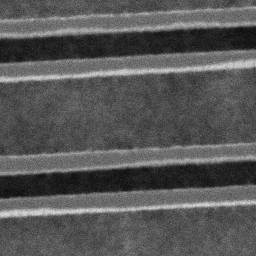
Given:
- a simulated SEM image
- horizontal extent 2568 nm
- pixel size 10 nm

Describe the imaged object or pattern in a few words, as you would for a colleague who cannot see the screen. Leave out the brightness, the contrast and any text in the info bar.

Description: lines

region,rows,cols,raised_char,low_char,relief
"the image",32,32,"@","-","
--------------------------------
---------------------@@@@@@@@@@@
---@@@@@@@@@@@@@@@@@@@@@@@@@@@@@
@@@@@@@@@@@@@@@@@@@@@@@@--------
@@@@@@--------------------------
--------------------------------
--------------------------@@@@@@
--------@@@@@@@@@@@@@@@@@@@@@@@@
@@@@@@@@@@@@@@@@@@@@@@@@@@@@----
@@@@@@@@@@@---------------------
--------------------------------
--------------------------------
--------------------------------
--------------------------------
--------------------------------
--------------------------------
--------------------------------
--------------------------------
---------------------@@@@@@@@@@@
---@@@@@@@@@@@@@@@@@@@@@@@@@@@@@
@@@@@@@@@@@@@@@@@@@@@@----------
@@@@@@@-------------------------
--------------------------------
---------------------------@@@@@
-------@@@@@@@@@@@@@@@@@@@@@@@@@
@@@@@@@@@@@@@@@@@@@@@@@@@@@@@@--
@@@@@@@@@@@---------------------
--------------------------------
--------------------------------
--------------------------------
--------------------------------
--------------------------------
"